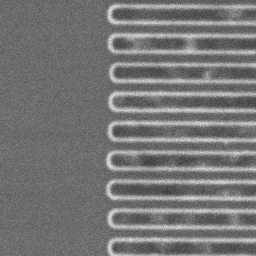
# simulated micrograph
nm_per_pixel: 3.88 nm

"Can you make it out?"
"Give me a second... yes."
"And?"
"parallel lines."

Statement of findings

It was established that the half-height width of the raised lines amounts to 0.0669 microns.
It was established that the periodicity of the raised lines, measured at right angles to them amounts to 113 nm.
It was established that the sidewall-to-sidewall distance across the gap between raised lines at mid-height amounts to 48 nanometres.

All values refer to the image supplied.